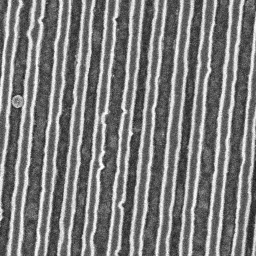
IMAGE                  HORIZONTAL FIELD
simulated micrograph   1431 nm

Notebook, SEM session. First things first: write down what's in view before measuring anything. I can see parallel lines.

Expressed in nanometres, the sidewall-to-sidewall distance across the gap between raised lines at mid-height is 84.8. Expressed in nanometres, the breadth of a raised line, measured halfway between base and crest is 56.2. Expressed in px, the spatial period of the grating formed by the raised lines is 24.7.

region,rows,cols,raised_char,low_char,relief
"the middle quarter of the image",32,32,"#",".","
...###...###....##...###....###.
...###...##.....##...###....##..
...###...###....##...###....###.
...###...##.....##...##....###..
...##....##.....##...##....###..
...###...##....###...##....###..
...##....##....###...##....###..
...##....##....###...##....###..
...##...###....###...##....###..
...##....##....##...###....###..
...##...###....##...###....###..
..###...###....##...##.....##...
..###...##.....##...##.....##...
..###...##.....##...##.....##...
..###...##.....##...##....###...
..###...##....###...##....###...
..##....##....###...##....###...
..##....##....###...##....###...
..##....##....##...###....###...
..##....##....##....##....###...
..##...###....##...###....###...
..##...###....##...###....###..#
.###...###....##...###....##...#
.###...##.....##...###....##...#
.###...##.....##...###...###...#
.###...###....##...###....##...#
.##....##.....##...##....###...#
.##....##....##....##....###...#
.##...###....##...###....###...#
.##...###....##...###....###...#
###...###....##...###....###...#
###...##.....##...###....##....#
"